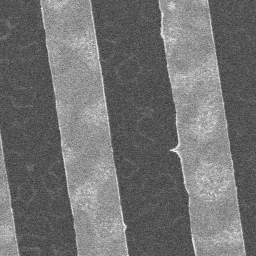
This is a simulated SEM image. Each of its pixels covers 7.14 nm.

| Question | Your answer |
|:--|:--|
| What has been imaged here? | one or a few lines or trenches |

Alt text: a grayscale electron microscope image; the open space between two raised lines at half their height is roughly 66.3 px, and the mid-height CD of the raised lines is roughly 49.2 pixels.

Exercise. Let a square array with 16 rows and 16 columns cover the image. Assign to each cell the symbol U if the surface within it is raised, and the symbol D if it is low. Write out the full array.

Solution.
DDDUUUDDDDUUUDDD
DDDUUUDDDDUUUDDD
DDDUUUDDDDUUUDDD
DDDUUUDDDDUUUUDD
DDDUUUDDDDDUUUDD
DDDUUUDDDDDUUUDD
DDDDUUUDDDDUUUDD
DDDDUUUDDDDUUUDD
DDDDUUUDDDDUUUDD
DDDDUUUDDDDUUUDD
DDDDUUUDDDDUUUUD
DDDDUUUDDDDDUUUD
UDDDUUUDDDDDUUUD
UDDDDUUUDDDDUUUD
UDDDDUUUDDDDUUUD
UDDDDUUUDDDDUUUD